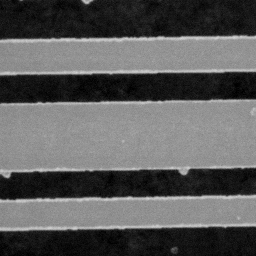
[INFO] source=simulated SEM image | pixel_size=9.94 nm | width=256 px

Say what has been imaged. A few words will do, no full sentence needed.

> lines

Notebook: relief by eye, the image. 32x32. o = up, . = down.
................................
................................
................................
................................
................................
oooooooooooooooooooooooooooooooo
oooooooooooooooooooooooooooooooo
oooooooooooooooooooooooooooooooo
oooooooooooooooooooooooooooooooo
................................
................................
................................
................................
oooooooooooooooooooooooooooooooo
oooooooooooooooooooooooooooooooo
oooooooooooooooooooooooooooooooo
oooooooooooooooooooooooooooooooo
oooooooooooooooooooooooooooooooo
oooooooooooooooooooooooooooooooo
oooooooooooooooooooooooooooooooo
oooooooooooooooooooooooooooooooo
................................
................................
................................
................................
oooooooooooooooooooooooooooooooo
oooooooooooooooooooooooooooooooo
oooooooooooooooooooooooooooooooo
oooooooooooo....................
................................
................................
................................